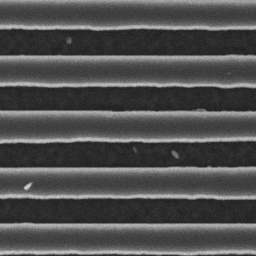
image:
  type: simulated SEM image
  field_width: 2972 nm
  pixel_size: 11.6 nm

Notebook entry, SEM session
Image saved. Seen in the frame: lines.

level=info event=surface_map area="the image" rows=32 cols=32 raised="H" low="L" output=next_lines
HHHHHHHHHHHHHHHHHHHHHHHHHHHHHHHH
HHHHHHHHHHHHHHHHHHHHHHHHHHHHHHHH
HHHHHHHHHHHHHHHHHHHHHHHHHHHHHHHH
LLLHHHHLLLHHHHHHLLLLHHHHHHHHHHHH
LLLLLLLLLLLLLLLLLLLLLLLLLLLLLLLL
LLLLLLLLLLLLLLLLLLLLLLLLLLLLLLLL
LLLLLLLLLLLLLLLLLLLLLLLLLLLLLLLL
HHHHHHHHHHHHHHHHHHHHHHHHHHHHHHHH
HHHHHHHHHHHHHHHHHHHHHHHHHHHHHHHH
HHHHHHHHHHHHHHHHHHHHHHHHHHHHHHHH
HHHHHHHHHHHHHHHHHHHHHHHHHHHHHHHH
LLLLLLLLLLLLLLLLLLLLLLLLLLLLLLLL
LLLLLLLLLLLLLLLLLLLLLLLLLLLLLLLL
LLLLLLLLLLLLLLLLLLLLLLLLLLLLLLLL
HHHHHHHHHHHHHHHHHHHHHHHHHHHHHHHH
HHHHHHHHHHHHHHHHHHHHHHHHHHHHHHHH
HHHHHHHHHHHHHHHHHHHHHHHHHHHHHHHH
HHHHHHHHHHHLHHHHHHHHHHHHHHHHHLLL
LLLLLLLLLLLLLLLLLLLLLLLLLLLLLLLL
LLLLLLLLLLLLLLLLLLLLLLLLLLLLLLLL
LLLLLLLLLLLLLLLLLLLLLLLLLLLLLLLL
HHHHHHHHHHHHHHHHHHHHHHHHHHHHHHHH
HHHHHHHHHHHHHHHHHHHHHHHHHHHHHHHH
HHHHHHHHHHHHHHHHHHHHHHHHHHHHHHHH
HHHHHHHHHHHHHHHHHHHHHHHHHHHHHHHH
LLLLLLLLLLLLLLLLLLLLLLLLLLLLLLLL
LLLLLLLLLLLLLLLLLLLLLLLLLLLLLLLL
LLLLLLLLLLLLLLLLLLLLLLLLLLLLLLLL
HHHHHHHHHHHHHHHHHHHHHHHHHHHHHHHH
HHHHHHHHHHHHHHHHHHHHHHHHHHHHHHHH
HHHHHHHHHHHHHHHHHHHHHHHHHHHHHHHH
HHHHHHHHHHHHHHHHHHHHHHHHHHHHHHHH